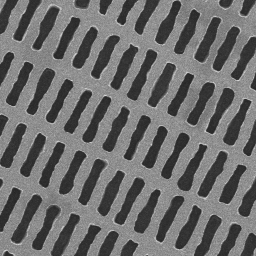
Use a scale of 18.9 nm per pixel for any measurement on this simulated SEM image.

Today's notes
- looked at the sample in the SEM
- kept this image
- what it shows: a regular array of holes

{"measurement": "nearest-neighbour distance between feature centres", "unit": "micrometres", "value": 0.4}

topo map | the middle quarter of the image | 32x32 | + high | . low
++...+++...++....++...+++...++++
+++++++...+++...+++..++++...++++
+++++++..++++...++...+++...++++.
++++++++.+++...+++...+++...+++..
..++++++++++..+++...+++....++...
..++++++++++..+++...+++...+++..+
..++++++++++++++...+++....+++..+
.++++..+++++++++...+++...+++...+
++++...+++.+++++...++...+++...++
+++...+++...+++++++++...+++...++
+++...++...+++++++++++.+++...+++
++...+++...+++..++++++++++...+++
++..++++..++++..++++++++++..+++.
+...+++...+++...+++..++++++++++.
+...+++..+++....+++...+++++++++.
...+++...+++...+++...+++++++++++
...+++..++++..++++...++...++++++
+++++...+++...+++...+++...+++..+
+++++...+++..++++...++...+++...+
+++++..+++...+++...+++...+++...+
++++++++++...+++..++++..++++..++
++++++++++..++++..+++...+++...++
+++..++++++++++..++++...+++..+++
++...++++++++++..+++...+++...+++
++...++...++++++++++...++...+++.
+...+++...++++++++++..+++...+++.
+...+++...++++++++++++++...+++..
...+++...++++..+++++++++...+++..
...+++...+++...+++.++++++.+++...
..+++...+++...+++...++++++++....
..+++...+++...+++...++++++++....
..+++..+++....++....+++.++++++.+